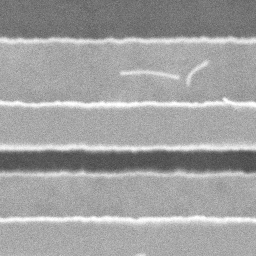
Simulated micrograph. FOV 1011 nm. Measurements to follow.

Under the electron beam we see lines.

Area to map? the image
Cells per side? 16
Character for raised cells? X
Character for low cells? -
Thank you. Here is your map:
----------------
----------------
---X--------X---
XXXXXXXXXXXXXXXX
XXXXXXXXXXXXXXXX
XXXXXXXXXXXXXXXX
XXXXXXXXXXXXXXXX
XXXXXXXXXXXXXXXX
XXXXXXXXXXXXXXXX
----------------
----------------
XXXXXXXXXXXXXXXX
XXXXXXXXXXXXXXXX
XXXXXXXXXXXXXXXX
XXXXXXXXXXXXXXXX
XXXXXXXXXXXXXXXX